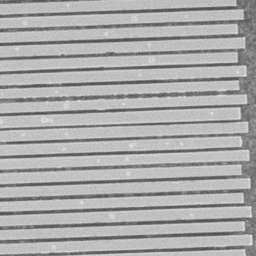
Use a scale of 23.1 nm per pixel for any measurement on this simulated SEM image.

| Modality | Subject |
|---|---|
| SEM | parallel lines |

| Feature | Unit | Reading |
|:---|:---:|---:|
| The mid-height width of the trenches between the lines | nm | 97.9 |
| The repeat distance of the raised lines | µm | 0.325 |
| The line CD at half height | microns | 0.236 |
